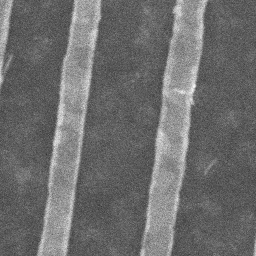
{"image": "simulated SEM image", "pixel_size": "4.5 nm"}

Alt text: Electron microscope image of one or a few lines or trenches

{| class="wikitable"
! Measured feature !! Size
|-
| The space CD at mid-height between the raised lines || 346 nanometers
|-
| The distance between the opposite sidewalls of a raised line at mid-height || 116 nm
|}